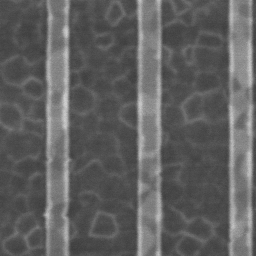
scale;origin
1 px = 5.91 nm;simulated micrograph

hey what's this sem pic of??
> one or a few lines or trenches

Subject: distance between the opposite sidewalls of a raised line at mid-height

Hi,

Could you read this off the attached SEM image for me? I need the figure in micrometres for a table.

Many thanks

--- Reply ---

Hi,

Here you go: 0.121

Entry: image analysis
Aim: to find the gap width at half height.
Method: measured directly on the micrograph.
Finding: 420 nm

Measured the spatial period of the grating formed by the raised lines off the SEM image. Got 91.6 px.